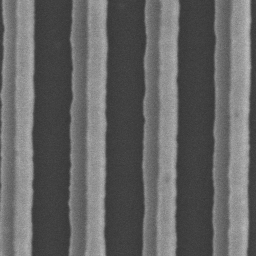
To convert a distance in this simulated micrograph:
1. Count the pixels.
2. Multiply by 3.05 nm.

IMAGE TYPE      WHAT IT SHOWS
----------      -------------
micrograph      lines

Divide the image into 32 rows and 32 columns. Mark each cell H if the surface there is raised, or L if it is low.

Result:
HHHHLLLLLHHHHLLLLLHHHHLLLLLHHHHL
HHHHLLLLLHHHHLLLLLHHHHLLLLLHHHHL
HHHHLLLLLHHHHLLLLLHHHHLLLLLHHHHL
LHHHLLLLLHHHHLLLLLHHHHLLLLLHHHHL
LHHHLLLLLHHHHLLLLLHHHHLLLLLHHHHL
HHHHLLLLLHHHHLLLLLHHHHLLLLLHHHHL
LHHHLLLLLHHHHLLLLLHHHHLLLLLHHHHL
HHHHLLLLLHHHHLLLLLHHHHLLLLLHHHHL
HHHHLLLLLHHHHLLLLLHHHHLLLLLHHHHL
HHHHLLLLLHHHHLLLLLHHHHLLLLLHHHHL
HHHHLLLLLHHHHLLLLLHHHHLLLLLHHHHL
HHHHLLLLLHHHHLLLLLHHHHLLLLLHHHHL
HHHHLLLLLHHHHLLLLLHHHHLLLLLHHHHL
HHHHLLLLLHHHHLLLLLHHHHLLLLLHHHHL
HHHHLLLLLHHHHLLLLLHHHHLLLLLHHHHL
HHHHLLLLLHHHHLLLLLHHHHLLLLLHHHHL
HHHHLLLLLHHHHLLLLLHHHHLLLLLHHHHL
HHHHLLLLLHHHHLLLLLHHHHLLLLLHHHHL
HHHHLLLLLHHHHLLLLLHHHHLLLLLHHHHL
HHHHLLLLLHHHHLLLLLHHHHLLLLLHHHHL
HHHHLLLLLHHHHLLLLLHHHHLLLLLHHHHL
HHHHLLLLLHHHHLLLLLHHHHLLLLLHHHHL
HHHHLLLLLHHHHLLLLLHHHHLLLLLHHHHL
HHHHLLLLLHHHHLLLLLHHHHLLLLLHHHHL
HHHHLLLLLHHHHLLLLLHHHHLLLLLHHHHL
HHHHLLLLLHHHHLLLLLHHHHLLLLLHHHHL
HHHHLLLLLHHHHLLLLLHHHHLLLLLHHHHL
HHHHLLLLLHHHHLLLLLHHHHLLLLLHHHHL
HHHHLLLLLHHHHLLLLLHHHHLLLLLHHHHL
HHHHLLLLLHHHHLLLLLHHHHLLLLLHHHHL
HHHHLLLLLHHHHLLLLLHHHHLLLLLHHHHL
HHHHLLLLLHHHHLLLLLHHHHLLLLLHHHHL